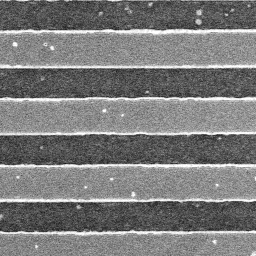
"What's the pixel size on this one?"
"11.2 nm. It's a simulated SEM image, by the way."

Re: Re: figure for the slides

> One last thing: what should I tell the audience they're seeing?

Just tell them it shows lines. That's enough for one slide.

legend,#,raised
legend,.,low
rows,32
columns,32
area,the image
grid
................................
................................
................................
................................
################################
################################
################################
################################
................................
................................
................................
................................
################################
################################
################################
################################
################################
................................
................................
................................
................................
################################
################################
################################
################################
................................
................................
................................
................................
################################
################################
################################